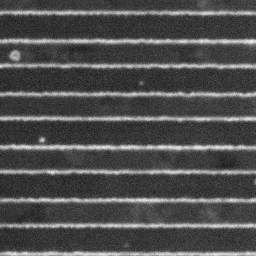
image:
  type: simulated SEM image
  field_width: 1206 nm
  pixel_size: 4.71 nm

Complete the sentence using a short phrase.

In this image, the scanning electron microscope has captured lines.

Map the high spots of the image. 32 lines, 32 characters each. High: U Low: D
UUUUUUUUUUUUUUUUUUUUUUUUUUUUUUUU
UUUUUUUUUUUUUUUUUUUUUUUUUUUUUUUU
DDDDDDDDDDDDDDDDDDDDDDDDDDDDDDDD
DDDDDDDDDDDDDDDDDDDDDDDDDDDDDDDD
DDDDDDDDDDDDDDDDDDDDDDDDDDDDDDDD
UUUUUUUUUUUUUUUUUUUUUUUUUUUUUUUU
UUUUUUUUUUUUUUUUUUUUUUUUUUUUUUUU
UUUUUUUUUUUUUUUUUUUUUUUUUUUUUUUU
DDDDDDDDDDDDDDDDDDDDDDDDDDDDDDDD
DDDDDDDDDDDDDDDDDDDDDDDDDDDDDDDD
DDDDDDDDDDDDDDDDDDDDDDDDDDDDDDDD
DDDDDDDDDDDDDDDDDDDDDDDDDDDDDDDD
UUUUUUUUUUUUUUUUUUUUUUUUUUUUUUUU
UUUUUUUUUUUUUUUUUUUUUUUUUUUUUUUU
UUUUUUUUUUUUUUUUUUUUUUUUUUUUUUUU
DDDDDDDDDDDDDDDDDDDDDDDDDDDDDDDD
DDDDDDDDDDDDDDDDDDDDDDDDDDDDDDDD
DDDDDDDDDDDDDDDDDDDDDDDDDDDDDDDD
UUUUUUUUUUUUUUUUUUUUUUUUUUUUUUUU
UUUUUUUUUUUUUUUUUUUUUUUUUUUUUUUU
UUUUUUUUUUUUUUUUUUUUUUUUUUUUUUUU
UUUUUUUUUUUUUUUUUUUUUUUUUUUUUUUU
DDDDDDDDDDDDDDDDDDDDDDDDDDDDDDDD
DDDDDDDDDDDDDDDDDDDDDDDDDDDDDDDD
DDDDDDDDDDDDDDDDDDDDDDDDDDDDDDDD
UUUUUUUUUUUUUUUUUUUUUUUUUUUUUUUU
UUUUUUUUUUUUUUUUUUUUUUUUUUUUUUUU
UUUUUUUUUUUUUUUUUUUUUUUUUUUUUUUU
DDDDDDDDDDDDDDDDDDDDDDDDDDDDDDDD
DDDDDDDDDDDDDDDDDDDDDDDDDDDDDDDD
DDDDDDDDDDDDDDDDDDDDDDDDDDDDDDDD
DDDDDDDDDDDDDDDDDDDDDDDDDDDDDDDD